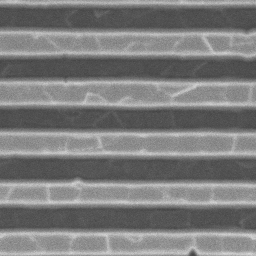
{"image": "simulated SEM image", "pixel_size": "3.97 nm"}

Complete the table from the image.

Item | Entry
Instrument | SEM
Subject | parallel lines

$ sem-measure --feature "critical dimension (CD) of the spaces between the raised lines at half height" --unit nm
102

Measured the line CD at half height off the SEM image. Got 98.3 nanometres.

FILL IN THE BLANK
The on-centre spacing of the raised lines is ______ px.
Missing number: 50.1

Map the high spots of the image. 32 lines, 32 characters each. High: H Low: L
HHHHHHHHHHHHHHHHHHHHHHHHHHHHHHHH
LLLLLLLLLLLLLLLLLLLLLLLLLLLLLLLL
LLLLLLLLLLLLLLLLLLLLLLLLLLLLLLLL
LLLLLLLLLLLLLLLLLLLLLLLLLLLLLLLL
HHHHHHHHHHHHHHHHHHHHHHHHHHHHHHHH
HHHHHHHHHHHHHHHHHHHHHHHHHHHHHHHH
HHHHHHHHHHHHHHHHHHHHHHHHHHHHHHHH
LLLLLLLLLLLLLLLLLLLLLLLLLLLLLLLL
LLLLLLLLLLLLLLLLLLLLLLLLLLLLLLLL
LLLLLLLLLLLLLLLLLLLLLLLLLLLLLLLL
HHHHHHHHHHHHHHHHHHHHHHHHHHHHHHHH
HHHHHHHHHHHHHHHHHHHHHHHHHHHHHHHH
HHHHHHHHHHHHHHHHHHHHHHHHHHHHHHHH
LLLLLLLLLLLLLLLLLLLLLLLLLLLLLLLL
LLLLLLLLLLLLLLLLLLLLLLLLLLLLLLLL
LLLLLLLLLLLLLLLLLLLLLLLLLLLLLLLL
HHHHHHHHHHHLLLLLLLLLLLLLHHHLLLLL
HHHHHHHHHHHHHHHHHHHHHHHHHHHHHHHH
HHHHHHHHHHHHHHHHHHHHHHHHHHHHHHHH
LLLLLLLLLLLLLLLLLLLLHHHHHHHHLLHH
LLLLLLLLLLLLLLLLLLLLLLLLLLLLLLLL
LLLLLLLLLLLLLLLLLLLLLLLLLLLLLLLL
LLLLLLLLLLLLLLLLLLLLLLLLLLLLLLLL
HHHHHHHHHHHHHHHHHHHHHHHHHHHHHHHH
HHHHHHHHHHHHHHHHHHHHHHHHHHHHHHHH
HHHHHHHHHHHHHHHHHHHHHHHHHHHHHHHH
LLLLLLLLLLLLLLLLLLLLLLLLLLLLLLLL
LLLLLLLLLLLLLLLLLLLLLLLLLLLLLLLL
LLLLLLLLLLLLLLLLLLLLLLLLLLLLLLLL
HHHHHHHHHHHHHHHHHHHHHHHHHHHHHHHH
HHHHHHHHHHHHHHHHHHHHHHHHHHHHHHHH
HHHHHHHHHHHHHHHHHHHHHHHHHHHHHHHH